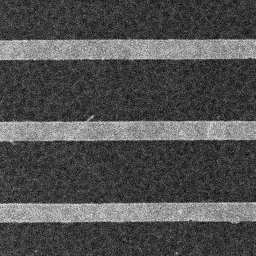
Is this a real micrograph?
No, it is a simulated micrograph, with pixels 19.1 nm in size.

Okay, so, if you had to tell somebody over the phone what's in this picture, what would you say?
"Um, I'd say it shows one or a few lines or trenches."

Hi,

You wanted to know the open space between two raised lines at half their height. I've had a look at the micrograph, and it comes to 1210 nanometres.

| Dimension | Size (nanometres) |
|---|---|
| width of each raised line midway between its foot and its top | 340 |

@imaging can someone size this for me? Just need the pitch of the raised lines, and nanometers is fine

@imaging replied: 1560